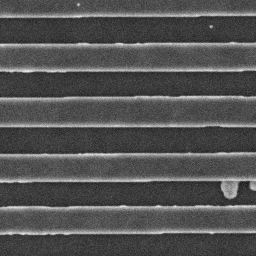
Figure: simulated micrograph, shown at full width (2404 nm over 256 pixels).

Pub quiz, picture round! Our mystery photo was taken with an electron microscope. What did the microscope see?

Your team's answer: lines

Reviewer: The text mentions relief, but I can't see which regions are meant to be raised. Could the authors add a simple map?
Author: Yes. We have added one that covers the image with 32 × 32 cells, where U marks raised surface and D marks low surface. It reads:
UUUUUUUUUUUUUUUUUUUUUUUUUUUUUUUU
UUUUUUUUUUUUUUUUUUUUUUUUUUUUUUUU
DDDDDDDDDDDDDDDDDDDDDDDDDDDDDDDD
DDDDDDDDDDDDDDDDDDDDDDDDDDDDDDDD
DDDDDDDDDDDDDDDDDDDDDDDDDDDDDDDD
DDDDDDDDDDUDDDUUDUUUUUUUUUUUUUUU
UUUUUUUUUUUUUUUUUUUUUUUUUUUUUUUU
UUUUUUUUUUUUUUUUUUUUUUUUUUUUUUUU
UUUUUUUUUUUUUUUUUUUUUUUUUUUUUUUU
DDDDDDDDDDDDDDDDDDDDDDDDDDDDDDDD
DDDDDDDDDDDDDDDDDDDDDDDDDDDDDDDD
DDDDDDDDDDDDDDDDDDDDDDDDDDDDDDDD
UUUUUUUUUUUUUUUUUUUUUUUUUUUUUUUU
UUUUUUUUUUUUUUUUUUUUUUUUUUUUUUUU
UUUUUUUUUUUUUUUUUUUUUUUUUUUUUUUU
UUUUUUUUUUUUUUUUUUUUUUUUUUUUUUUU
DDDDDDDDDDDDDDDDDDDDDDDDDDDDDDDD
DDDDDDDDDDDDDDDDDDDDDDDDDDDDDDDD
DDDDDDDDDDDDDDDDDDDDDDDDDDDDDDDD
UUUUUUUUUUUUUUUUUUUUUUUUUUUUUUUU
UUUUUUUUUUUUUUUUUUUUUUUUUUUUUUUU
UUUUUUUUUUUUUUUUUUUUUUUUUUUUUUUU
UUUUUUUUUUUUUUUUUUUUUUUUUUUUUUUU
DDDDDDDDDDDDDDDDDDDDDDDDDDDDUDDD
DDDDDDDDDDDDDDDDDDDDDDDDDDDDDDDD
DDDDDDDDDDDDDDDDDDDDDDDDDDDDDDDD
UUUUUUUUUUUUUUUUUUUUUUUUUUUUUUUU
UUUUUUUUUUUUUUUUUUUUUUUUUUUUUUUU
UUUUUUUUUUUUUUUUUUUUUUUUUUUUUUUU
DDDDDDDDDDDDDDDDDDDDDDDDDDDDDDDD
DDDDDDDDDDDDDDDDDDDDDDDDDDDDDDDD
DDDDDDDDDDDDDDDDDDDDDDDDDDDDDDDD